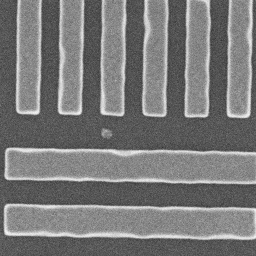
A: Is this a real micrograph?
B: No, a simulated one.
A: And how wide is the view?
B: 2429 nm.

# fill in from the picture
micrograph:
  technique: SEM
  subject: groups of lines, slits or small figures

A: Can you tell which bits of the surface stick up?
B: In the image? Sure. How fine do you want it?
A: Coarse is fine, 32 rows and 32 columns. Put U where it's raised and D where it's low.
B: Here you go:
DDUUUDDDUUDDDUUUDDUUUDDUUUDDDUUD
DDUUUDDDUUDDDUUUDDUUUDDUUUDDDUUD
DDUUUDDDUUDDDUUUDDUUUDDUUUDDDUUD
DDUUUDDDUUDDDUUUDDUUUDDUUUDDDUUD
DDUUUDDUUUDDDUUUDDUUUDDUUUDDDUUD
DDUUUDDUUUDDDUUUDDUUUDDUUUDDDUUD
DDUUUDDDUUDDDUUUDDUUUDDUUUDDDUUD
DDUUUDDDUUDDDUUUDDUUUDDUUUDDDUUD
DDUUUDDDUUDDDUUUDDUUUDDUUUDDDUUD
DDUUUDDDUUDDDUUUDDUUUDDUUUDDDUUD
DDUUUDDDUUDDDUUUDDUUUDDUUUDDDUUD
DDUUUDDUUUDDDUUDDDUUUDDUUUDDUUUD
DDUUUDDUUUDDDUUDDDUUUDDUUUDDUUUD
DDUUUDDUUUDDDUUDDDUUUDDUUUDDUUUD
DDDDDDDDDDDDDDDDDDDDDDDUUUDDDUUD
DDDDDDDDDDDDDDDDDDDDDDDDDDDDDDDD
DDDDDDDDDDDDDDDDDDDDDDDDDDDDDDDD
DDDDDDDDDDDDDDDDDDDDDDDDDDDDDDDD
DDDDDDDDDDDDDDDDDDDDDDDDDDDDDDDD
DUUUUUUUUUUUUUUUUUUUUUUUUUUUUUUU
DUUUUUUUUUUUUUUUUUUUUUUUUUUUUUUU
DUUUUUUUUUUUUUUUUUUUUUUUUUUUUUUU
DDDDDDDDDDDDUUUUUUUUUUUUUUUUUUUU
DDDDDDDDDDDDDDDDDDDDDDDDDDDDDDDD
DDDDDDDDDDDDDDDDDDDDDDDDDDDDDDDD
DDDDDDDDDDDDDDDDDDDDDDDDDDDDDDDD
DUUUUUUUUUUUUUUUUUUUUUUUUUUUUUUU
DUUUUUUUUUUUUUUUUUUUUUUUUUUUUUUU
DUUUUUUUUUUUUUUUUUUUUUUUUUUUUUUU
DDDDDDDDDUUDDDDDUUUUUUUUUUUUUUUU
DDDDDDDDDDDDDDDDDDDDDDDDDDDDDDDD
DDDDDDDDDDDDDDDDDDDDDDDDDDDDDDDD